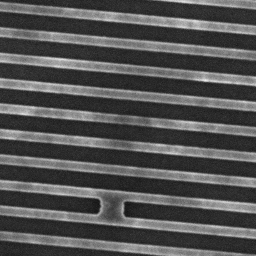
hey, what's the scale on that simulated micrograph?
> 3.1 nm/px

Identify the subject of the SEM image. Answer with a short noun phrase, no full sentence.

parallel lines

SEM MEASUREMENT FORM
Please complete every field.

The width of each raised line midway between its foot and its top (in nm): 24.7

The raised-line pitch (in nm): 78.6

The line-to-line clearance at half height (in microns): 0.0524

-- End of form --